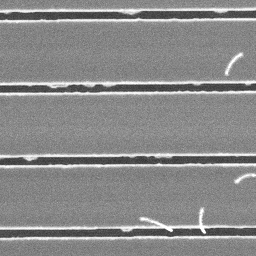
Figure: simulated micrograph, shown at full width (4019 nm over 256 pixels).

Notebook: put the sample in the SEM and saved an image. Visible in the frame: lines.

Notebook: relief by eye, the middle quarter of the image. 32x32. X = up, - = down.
XXXXXXXXXXXXXXXXXXXXXXXXXXXXXXXX
XXXXXXXXXXXXXXXXXXXXXXXXXXXXXXXX
XXXXXXXXXXXXXXXXXXXXXXXXXXXXXXXX
XXXXXXXXXXXXXXXXXXXXXXXXXXXXXXXX
XXXXXXXXXXXXXXXXXXXXXXXXXXXXXXXX
--------------------------------
--------------------------------
XXXXXXXXXXXXXXXXXXXXXXXXXXXXXXXX
XXXXXXXXXXXXXXXXXXXXXXXXXXXXXXXX
XXXXXXXXXXXXXXXXXXXXXXXXXXXXXXXX
XXXXXXXXXXXXXXXXXXXXXXXXXXXXXXXX
XXXXXXXXXXXXXXXXXXXXXXXXXXXXXXXX
XXXXXXXXXXXXXXXXXXXXXXXXXXXXXXXX
XXXXXXXXXXXXXXXXXXXXXXXXXXXXXXXX
XXXXXXXXXXXXXXXXXXXXXXXXXXXXXXXX
XXXXXXXXXXXXXXXXXXXXXXXXXXXXXXXX
XXXXXXXXXXXXXXXXXXXXXXXXXXXXXXXX
XXXXXXXXXXXXXXXXXXXXXXXXXXXXXXXX
XXXXXXXXXXXXXXXXXXXXXXXXXXXXXXXX
XXXXXXXXXXXXXXXXXXXXXXXXXXXXXXXX
XXXXXXXXXXXXXXXXXXXXXXXXXXXXXXXX
XXXXXXXXXXXXXXXXXXXXXXXXXXXXXXXX
XXXXXXXXXXXXXXXXXXXXXXXXXXXXXXXX
--------------------------------
--------------------------------
XXXXXXXXXXXXXXXXXXXXXXXXXXXXXXXX
XXXXXXXXXXXXXXXXXXXXXXXXXXXXXXXX
XXXXXXXXXXXXXXXXXXXXXXXXXXXXXXXX
XXXXXXXXXXXXXXXXXXXXXXXXXXXXXXXX
XXXXXXXXXXXXXXXXXXXXXXXXXXXXXXXX
XXXXXXXXXXXXXXXXXXXXXXXXXXXXXXXX
XXXXXXXXXXXXXXXXXXXXXXXXXXXXXXXX